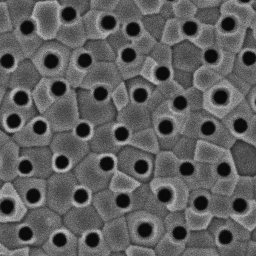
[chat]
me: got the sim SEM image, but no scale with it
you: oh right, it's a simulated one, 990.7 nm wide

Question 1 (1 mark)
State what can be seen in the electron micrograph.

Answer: a regular array of holes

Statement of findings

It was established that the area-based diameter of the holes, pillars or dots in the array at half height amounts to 0.055 µm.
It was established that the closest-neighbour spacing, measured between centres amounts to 130 nm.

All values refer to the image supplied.